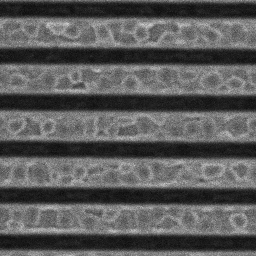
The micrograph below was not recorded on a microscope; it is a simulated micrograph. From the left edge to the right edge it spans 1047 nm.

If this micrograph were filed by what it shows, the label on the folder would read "parallel lines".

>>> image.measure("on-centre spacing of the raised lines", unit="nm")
190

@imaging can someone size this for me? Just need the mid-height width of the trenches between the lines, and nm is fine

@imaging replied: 61.3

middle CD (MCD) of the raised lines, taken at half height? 30.9 pixels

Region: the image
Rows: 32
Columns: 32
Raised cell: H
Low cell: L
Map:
LLLLLLLLLLLLLLLLLLLLLLLLLLLLLLLL
LLLLLLLLLLLLLLLLLLLLLLLLLLLLLLLL
HHHHHHHHHHHHHHHHHHHHHHHHHHHHHHHH
HHHHHHHHHHHHHHHHHHHHHHHHHHHHHHHH
HHHHHHHHHHHHHHHHHHHHHHHHHHHHHHHH
HHHHHHHHHHHHHHHHHHHHHHHHHHHHHHHH
LLLLLLLLLLLLLLLLLLLLLLLLLLLLLLLL
LLLLLLLLLLLLLLLLLLLLLLLLLLLLLLLL
HHHHHHHHHHHHHHHHHHHHHHHHHHHHHHHH
HHHHHHHHHHHHHHHHHHHHHHHHHHHHHHHH
HHHHHHHHHHHHHHHHHHHHHHHHHHHHHHHH
HHHHHHHHHHHHHHHHHHHHHHHHHHHHHHHH
LLLLLLLLLLLLLLLLLLLLLLLLLLLLLLLL
LLLLLLLLLLLLLLLLLLLLLLLLLLLLLLLL
HHHHHHHHHHHHHHHHHHHHHHHHHHHHHHHH
HHHHHHHHHHHHHHHHHHHHHHHHHHHHHHHH
HHHHHHHHHHHHHHHHHHHHHHHHHHHHHHHH
HHHHHHHHHHHHHHHHHHHHHHHHHHHHHHHH
LLLLLLLLLLLLLLLLLLLLLLLLLLLLLLLL
LLLLLLLLLLLLLLLLLLLLLLLLLLLLLLLL
HHHHHHHHHHHHHHHHHHHHHHHHHHHHHHHH
HHHHHHHHHHHHHHHHHHHHHHHHHHHHHHHH
HHHHHHHHHHHHHHHHHHHHHHHHHHHHHHHH
HLLLLLLLLLLLLLLLLLHHLLHHHHHHHHHH
LLLLLLLLLLLLLLLLLLLLLLLLLLLLLLLL
LLLLLLHHLHHHHLLLLLLHLHHLLLLLLLLL
HHHHHHHHHHHHHHHHHHHHHHHHHHHHHHHH
HHHHHHHHHHHHHHHHHHHHHHHHHHHHHHHH
HHHHHHHHHHHHHHHHHHHHHHHHHHHHHHHH
LLLLLLLLLLLLLLLLLLLLLLLLLLLLLLLL
LLLLLLLLLLLLLLLLLLLLLLLLLLLLLLLL
HHHHHHHHHHHHHHHHHHHHHHHHHHHHHHHH